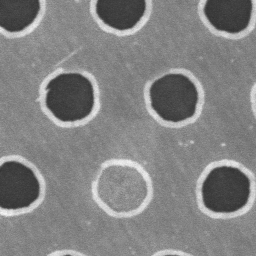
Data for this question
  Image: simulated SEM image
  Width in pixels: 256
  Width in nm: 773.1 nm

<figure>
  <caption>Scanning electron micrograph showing holes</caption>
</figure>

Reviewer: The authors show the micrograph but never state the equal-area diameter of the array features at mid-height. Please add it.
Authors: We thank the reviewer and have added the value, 148 nm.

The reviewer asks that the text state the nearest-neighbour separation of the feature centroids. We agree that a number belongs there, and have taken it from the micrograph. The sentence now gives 312 nm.